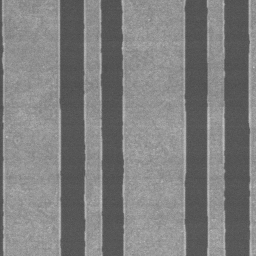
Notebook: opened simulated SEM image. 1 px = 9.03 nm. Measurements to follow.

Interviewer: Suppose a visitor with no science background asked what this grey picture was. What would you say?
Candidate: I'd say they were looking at lines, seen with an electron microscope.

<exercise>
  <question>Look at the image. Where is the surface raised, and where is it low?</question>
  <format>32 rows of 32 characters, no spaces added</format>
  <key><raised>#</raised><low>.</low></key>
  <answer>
#######....##..########...##...#
#######....##..########...##...#
#######....##..########...##...#
#######....##..########...##...#
#######....##..########...##...#
.######....##..########...##...#
#######....##..########...##...#
#######....##..########...##...#
#######....##..########...##...#
.######....##..########...##...#
.######....##..########...##...#
.######....##..########...##...#
.######....##..########...##...#
.######....##..########...##...#
.######....##..########...##...#
.######....##..########...##...#
.######....##..########...##...#
.######....##..########...##...#
.######....##..########...##...#
.######....##..########...##...#
.######....##...#######...##...#
.######....##...#######...##...#
.######....##..########...##...#
.######....##..########...##...#
.######....##..########...##...#
.######....##..########...##...#
.######....##...#######...##...#
.######....##...#######...##...#
.######....##...#######...##...#
.######....##...#######...##...#
.######....##...#######...##...#
.######....##...#######...##...#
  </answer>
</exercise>